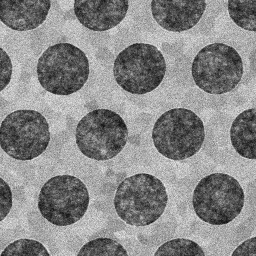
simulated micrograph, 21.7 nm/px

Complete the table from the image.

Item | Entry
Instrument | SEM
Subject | a regular array of holes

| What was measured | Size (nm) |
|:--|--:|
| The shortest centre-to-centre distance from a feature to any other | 1650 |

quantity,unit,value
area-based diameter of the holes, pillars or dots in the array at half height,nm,1130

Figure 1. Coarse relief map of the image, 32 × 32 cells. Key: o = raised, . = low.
......ooo.......ooo...o...oo....
......ooo.......ooo.......ooo...
......oooo.....oooo......oooo...
o....oooooo...oooooo....oooooo..
oooooooooooooooooooooooooooooooo
ooooooo..oooooooo..ooooooo..oooo
.oooo.....ooooo.....ooooo.....oo
.oooo......ooo.......ooo......oo
..ooo......ooo.......ooo......oo
.oooo......ooo.......ooo......oo
.oooo......oooo.....oooo......oo
oooooo...ooooooo...ooooooo...ooo
oooooooooooooooooooooooooooooooo
oooooooooooooooooooooo.ooooooooo
o....oooooo....ooooo.....ooooo..
......oooo......ooo......oooo...
......ooo.......ooo.......ooo...
......ooo.......ooo......oooo...
......oooo.....oooo......oooo...
o....oooooo...oooooo....oooooo..
oooooooooooooooooooooooooooooooo
oooooooooooooooooooooooooooooooo
oooooo....ooooo.....ooooo.....oo
.oooo......oooo......ooo......oo
.oooo......ooo.......ooo.......o
.oooo......ooo.......ooo......oo
.oooo......oooo.....oooo......oo
oooooo....ooooo.....ooooo....ooo
oooooooooooooooooooooooooooooooo
oooooooooooooooooooooooooooooooo
o....oooooo....ooooo.....ooooo..
......oooo......ooo......oooo...